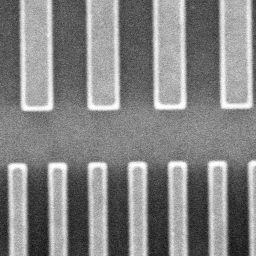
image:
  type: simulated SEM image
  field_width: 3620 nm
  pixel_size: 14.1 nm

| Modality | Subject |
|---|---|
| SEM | groups of lines, slits or small figures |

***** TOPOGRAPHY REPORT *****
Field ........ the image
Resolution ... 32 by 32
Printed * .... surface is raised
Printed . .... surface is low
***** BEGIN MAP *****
...***.....***.....****.....***.
...***.....***.....****.....***.
...***.....***.....****.....***.
...***.....****....****.....***.
...***.....****....****.....***.
...***.....****....****.....***.
...***.....****....****.....***.
...***.....****....****.....***.
...***.....****....****.....***.
...***.....****....****.....***.
...***.....****.....***.....***.
...***.....****.....***.....***.
...***.....****.....***.....***.
...***..........................
................................
................................
................................
................................
................................
................................
...........................*....
.**...**...**...**...**...**...*
.**...**...**...**...**...**...*
.**...**...**...**...**...**...*
.**...**...**...**...**...**...*
.**...**...**...**...**...**...*
.**...**...**...**...**...**...*
.**...**...**...**...**...**...*
.**...**...**...**...**...**...*
.**...**...**...**...**...**...*
.**...**...**...**...**...**...*
.**...**...**...**...**...**...*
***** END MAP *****